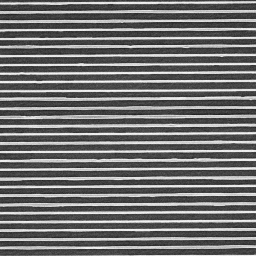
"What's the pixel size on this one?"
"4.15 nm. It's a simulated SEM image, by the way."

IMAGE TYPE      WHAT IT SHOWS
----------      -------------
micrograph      parallel lines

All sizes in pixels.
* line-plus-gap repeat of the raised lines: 8.75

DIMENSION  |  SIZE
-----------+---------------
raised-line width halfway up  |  10.4 nanometres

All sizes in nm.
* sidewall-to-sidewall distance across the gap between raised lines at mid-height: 28